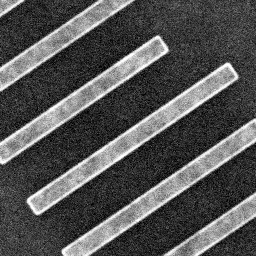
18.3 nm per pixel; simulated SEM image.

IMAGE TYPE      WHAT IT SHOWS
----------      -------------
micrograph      groups of lines, slits or small figures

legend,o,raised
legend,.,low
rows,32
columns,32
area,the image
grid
oo..........oooo................
o.........oooo..................
.........oooo...................
........oooo....................
......oooo......................
.....oooo.........oo............
...oooo..........oooo...........
..oooo.........oooo.............
oooo..........oooo..........o...
ooo.........oooo..........ooo...
o..........oooo..........oooo...
.........oooo..........oooo.....
........oooo..........oooo......
.......oooo.........oooo........
.....oooo..........oooo.........
....oooo.........oooo..........o
..oooo..........oooo..........oo
.oooo.........oooo..........oooo
ooo..........oooo..........oooo.
oo.........oooo..........oooo...
..........oooo..........oooo....
........oooo..........oooo......
.......oooo..........oooo.......
......oooo.........oooo.........
....oooo..........oooo.........o
....ooo.........oooo..........oo
....o..........oooo..........ooo
.............oooo..........oooo.
............oooo..........oooo..
..........oooo..........oooo....
.........oooo..........oooo.....
........oooo.........oooo.......